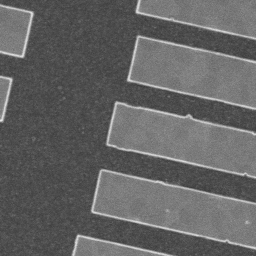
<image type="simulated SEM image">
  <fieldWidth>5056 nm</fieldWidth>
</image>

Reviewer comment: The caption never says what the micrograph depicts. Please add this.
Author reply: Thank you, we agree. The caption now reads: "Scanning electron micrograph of one or a few lines or trenches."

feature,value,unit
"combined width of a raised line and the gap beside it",1330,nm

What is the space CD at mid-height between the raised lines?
482 nm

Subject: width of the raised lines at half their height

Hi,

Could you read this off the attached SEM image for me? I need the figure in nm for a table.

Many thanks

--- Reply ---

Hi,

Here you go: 855